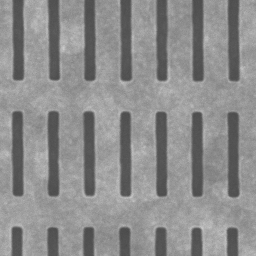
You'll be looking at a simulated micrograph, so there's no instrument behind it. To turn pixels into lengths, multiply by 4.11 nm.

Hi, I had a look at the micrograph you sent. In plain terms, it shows holes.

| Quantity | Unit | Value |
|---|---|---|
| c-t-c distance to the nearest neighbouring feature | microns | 0.146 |